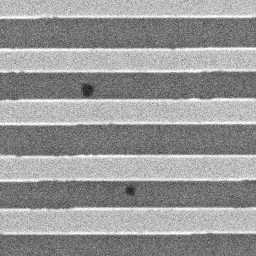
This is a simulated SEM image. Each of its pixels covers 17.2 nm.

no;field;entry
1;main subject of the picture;lines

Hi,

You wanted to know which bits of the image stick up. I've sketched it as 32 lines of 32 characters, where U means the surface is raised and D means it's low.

UUUUUUUUUUUUUUUUUUUUUUUUUUUUUUUU
UUUUUUUUUUUUUUUUUUUUUUUUUUUUUUUU
DDDDDDDDDDDDDDDDDDDDDDDDDDDDDDDD
DDDDDDDDDDDDDDDDDDDDDDDDDDDDDDDD
DDDDDDDDDDDDDDDDDDDDDDDDDDDDDDDD
DDDDDDDDDDDDDDDDDDDDDDDDDDDDDDDD
UUUUUUUUUUUUUUUUUUUUUUUUUUUUUUUU
UUUUUUUUUUUUUUUUUUUUUUUUUUUUUUUU
UUUUUUUUUUUUUUUUUUUUUUUUUUUUUUUU
DDDDDDDDDDDDDDDDDDDDDDDDDDDDDDDD
DDDDDDDDDDDDDDDDDDDDDDDDDDDDDDDD
DDDDDDDDDDDDDDDDDDDDDDDDDDDDDDDD
DDDDDDDDDDDDDDDDDDDDDDUUUUUUUUUU
UUUUUUUUUUUUUUUUUUUUUUUUUUUUUUUU
UUUUUUUUUUUUUUUUUUUUUUUUUUUUUUUU
DDDDDDDDDDDDDDDDDDDDDDDDDDDDDDDD
DDDDDDDDDDDDDDDDDDDDDDDDDDDDDDDD
DDDDDDDDDDDDDDDDDDDDDDDDDDDDDDDD
DDDDDDDDDDDDDDDDDDDDDDDDDDDDDDDD
DDDDDDDDDDDDDDDDDDDDDDDDDDDDDDDD
UUUUUUUUUUUUUUUUUUUUUUUUUUUUUUUU
UUUUUUUUUUUUUUUUUUUUUUUUUUUUUUUU
UUUUUUUUUDDDDDDDDDDDDDDDDDDDDDDD
DDDDDDDDDDDDDDDDDDDDDDDDDDDDDDDD
DDDDDDDDDDDDDDDDDDDDDDDDDDDDDDDD
DDDDDDDDDDDDDDDDDDDDDDDDDDDDDDDD
UUUUUUUUUUUUUUUUUUUUUUUUUUUUUUUU
UUUUUUUUUUUUUUUUUUUUUUUUUUUUUUUU
UUUUUUUUUUUUUUUUUUUUUUUUUUUUUUUU
DDDDDDDDDDDDDDDDDDDDDDDDDDDDDDDD
DDDDDDDDDDDDDDDDDDDDDDDDDDDDDDDD
DDDDDDDDDDDDDDDDDDDDDDDDDDDDDDDD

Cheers